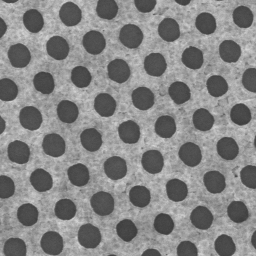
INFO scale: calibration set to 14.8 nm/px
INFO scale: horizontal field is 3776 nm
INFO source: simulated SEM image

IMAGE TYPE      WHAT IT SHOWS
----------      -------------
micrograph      a regular array of holes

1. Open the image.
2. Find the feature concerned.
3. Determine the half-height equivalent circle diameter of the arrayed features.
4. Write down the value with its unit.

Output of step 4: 340 nanometers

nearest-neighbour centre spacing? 0.535 micrometres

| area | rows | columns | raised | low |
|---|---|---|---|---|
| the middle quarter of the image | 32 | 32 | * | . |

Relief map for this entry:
***..******.....****......****..
**....*****......***.....*******
**.....****......****....*******
**.....****.....****************
**.....******..*************..**
***...********************.....*
*****************.....****......
*********..******.....****......
********....*****......****....*
..******.....****......****....*
...****......****.....**********
....****.....******..***********
....*****...********************
...*********************...*****
...************...*****.....****
**************.....****.....****
*****...*****......****.....****
****.....*****.....****.....****
****.....*****.....*****..******
****......*****...*************.
*****....********************...
******..*************..******...
********************....*****...
***********....****......****...
**********......***......*****..
**...*****......****.....******.
*.....****......****.....*******
*.....****......******.*********
*.....*****....*****************
**....********************....**
***..*************..*****......*
****************.....****......*